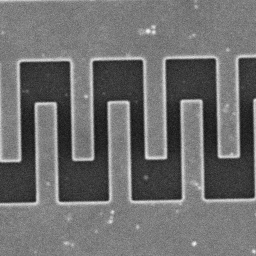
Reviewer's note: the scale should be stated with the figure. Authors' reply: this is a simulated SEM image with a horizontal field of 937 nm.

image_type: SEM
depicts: groups of lines, slits or small figures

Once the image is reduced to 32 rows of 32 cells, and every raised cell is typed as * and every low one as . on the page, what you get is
********************************
********************************
********************************
********************************
********************************
********************************
********************************
************......***......***..
**.......***......***......***..
**.......***......***......***..
**.......***......***......***..
**.......***......***......***..
**.......***......***......***..
***.***..***..**..***..**..***..
***.***..***..**..***..**..***..
***.***..***..**..***..**..***..
***.***..***..**..***..**..***..
***.***..***..**..***..**..***..
***..**..***..**..***..**..***..
***..**..***..**..***..**..***..
.....**.......**.......**.......
.....**.......**.......**.......
.....**.......**.......**.......
.....**.......**.......**.......
.....**.......**.......***......
..******************************
********************************
********************************
********************************
********************************
********************************
********************************